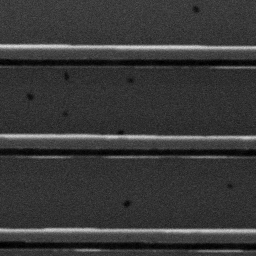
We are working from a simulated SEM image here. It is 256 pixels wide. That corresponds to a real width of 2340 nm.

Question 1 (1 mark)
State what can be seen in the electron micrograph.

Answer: lines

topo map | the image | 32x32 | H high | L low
LLLLLLLLLLLLLLLLLLLLLLLLLLLLLLLL
LLLLLLLLLLLLLLLLLLLLLLLLLLLLLLLL
LLLLLLLLLLLLLLLLLLLLLLLLLLLLLLLL
LLLLLLLLLLLLLLLLLLLLLLLLLLLLLLLL
LLLLLLLLLLLLLLLLLLLLLLLLLLLLLLLL
LLLLLLLLLLLLLLLLLLLLLLLLLLLLLLLL
HHHHHHHHHHHHHHHHHHHHHHHHHHHHHHHH
HHHHHHHHHHHHHHHHHHHHHHHHHHHHHHHH
LLLLLLLLLLLLLLLLLLLLLLLLLLLLLLLL
LLLLLLLLLLLLLLLLLLLLLLLLLLLLLLLL
LLLLLLLLLLLLLLLLLLLLLLLLLLLLLLLL
LLLLLLLLLLLLLLLLLLLLLLLLLLLLLLLL
LLLLLLLLLLLLLLLLLLLLLLLLLLLLLLLL
LLLLLLLLLLLLLLLLLLLLLLLLLLLLLLLL
LLLLLLLLLLLLLLLLLLLLLLLLLLLLLLLL
LLLLLLLLLLLLLLLLLLLLLLLLLLLLLLLL
LLLLLLLLLLLLLLLLLLLLLLLLLLLLLLLL
HHHHHHHHHHHHHHHHHHHHHHHHHHHHHHHH
HHHHHHHHHHHHHHHHHHHHHHHHHHHHHHHH
HHHHHHHHHHHHHHHHHHHHHHHHHHHHHHHH
LLLLLLLLLLLLLLLLLLLLLLLLLLLLLLLL
LLLLLLLLLLLLLLLLLLLLLLLLLLLLLLLL
LLLLLLLLLLLLLLLLLLLLLLLLLLLLLLLL
LLLLLLLLLLLLLLLLLLLLLLLLLLLLLLLL
LLLLLLLLLLLLLLLLLLLLLLLLLLLLLLLL
LLLLLLLLLLLLLLLLLLLLLLLLLLLLLLLL
LLLLLLLLLLLLLLLLLLLLLLLLLLLLLLLL
LLLLLLLLLLLLLLLLLLLLLLLLLLLLLLLL
LLLLLLLLLLLLLLLLLLLLLLLLLLLLLLLL
HHHHHHHHHHHHHHHHHHHHHHHHHHHHHHHH
HHHHHHHHHHHHHHHHHHHHHHHHHHHHHHHH
LLLLLLLLLLLLLLLLLLLLLLLLLLLLLLLL